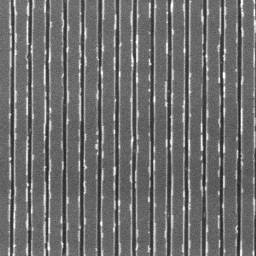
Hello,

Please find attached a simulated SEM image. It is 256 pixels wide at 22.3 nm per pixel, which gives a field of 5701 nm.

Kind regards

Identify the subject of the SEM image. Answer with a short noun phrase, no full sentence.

parallel lines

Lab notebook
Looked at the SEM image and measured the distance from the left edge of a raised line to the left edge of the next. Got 389 nm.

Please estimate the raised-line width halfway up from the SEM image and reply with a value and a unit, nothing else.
301 nm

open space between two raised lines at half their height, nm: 86.3